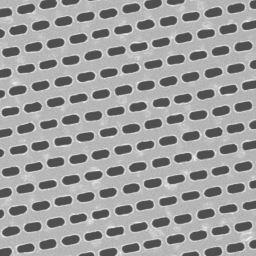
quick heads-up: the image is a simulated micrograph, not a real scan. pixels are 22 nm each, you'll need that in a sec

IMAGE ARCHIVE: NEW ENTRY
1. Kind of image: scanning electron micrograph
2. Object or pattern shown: a regular array of holes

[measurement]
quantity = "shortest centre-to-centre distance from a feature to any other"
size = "490 nanometers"